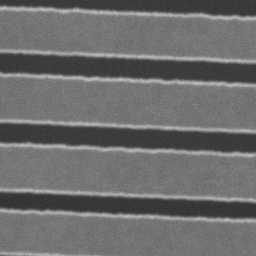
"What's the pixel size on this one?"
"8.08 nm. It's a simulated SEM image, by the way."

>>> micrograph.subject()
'lines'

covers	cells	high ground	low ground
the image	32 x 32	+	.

................................
+++++++++++++++.................
++++++++++++++++++++++++++++++++
++++++++++++++++++++++++++++++++
++++++++++++++++++++++++++++++++
++++++++++++++++++++++++++++++++
++++++++++++++++++++++++++++++++
.........................+++++++
................................
++++++++........................
+++++++++++++++++++++++++++++++.
++++++++++++++++++++++++++++++++
++++++++++++++++++++++++++++++++
++++++++++++++++++++++++++++++++
++++++++++++++++++++++++++++++++
......++++++++++++++++++++++++++
..............................++
................................
++++++++++++++++................
++++++++++++++++++++++++++++++++
++++++++++++++++++++++++++++++++
++++++++++++++++++++++++++++++++
++++++++++++++++++++++++++++++++
++++++++++++++++++++++++++++++++
..............++++++++++++++++++
................................
+++++++++.......................
++++++++++++++++++++++++++++++++
++++++++++++++++++++++++++++++++
++++++++++++++++++++++++++++++++
++++++++++++++++++++++++++++++++
++++++++++++++++++++++++++++++++